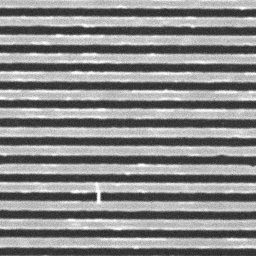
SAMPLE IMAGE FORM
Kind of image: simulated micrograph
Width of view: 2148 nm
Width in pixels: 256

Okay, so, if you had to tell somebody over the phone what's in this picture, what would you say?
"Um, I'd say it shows parallel lines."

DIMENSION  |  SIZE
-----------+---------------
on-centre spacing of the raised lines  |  0.155 um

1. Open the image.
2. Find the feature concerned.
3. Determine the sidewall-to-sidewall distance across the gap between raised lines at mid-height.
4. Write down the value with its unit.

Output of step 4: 80.8 nanometres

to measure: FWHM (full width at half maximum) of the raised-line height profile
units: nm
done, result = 73.5